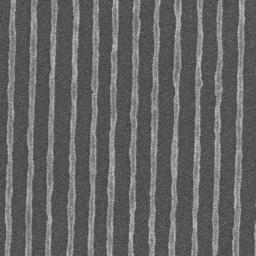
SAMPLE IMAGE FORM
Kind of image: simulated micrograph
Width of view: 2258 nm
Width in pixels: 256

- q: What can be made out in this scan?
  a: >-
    parallel lines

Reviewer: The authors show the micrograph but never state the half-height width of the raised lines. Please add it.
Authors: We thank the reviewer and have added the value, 45.2 nm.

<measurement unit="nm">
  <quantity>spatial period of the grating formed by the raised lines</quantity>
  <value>183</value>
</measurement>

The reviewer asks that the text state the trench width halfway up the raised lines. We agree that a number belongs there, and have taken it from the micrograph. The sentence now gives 141 nm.